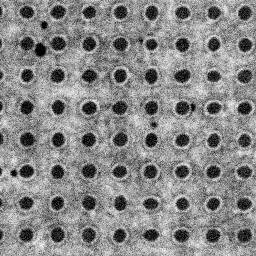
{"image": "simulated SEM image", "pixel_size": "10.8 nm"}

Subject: a regular array of raised bodies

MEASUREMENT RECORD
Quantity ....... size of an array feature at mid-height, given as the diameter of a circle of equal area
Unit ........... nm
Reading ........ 181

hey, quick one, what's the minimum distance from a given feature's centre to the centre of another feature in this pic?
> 335 nanometers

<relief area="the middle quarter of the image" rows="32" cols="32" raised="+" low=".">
................................
.....+++.....+++....+++......++.
....++++....++++....++++....++++
....++++....++++....++++...+++++
.....+++.....++.....+++.....+++.
................................
................................
................................
................................
.....+++.....++......++.....+++.
....++++....++++....++++....++++
....+++++...++++....++++....++++
.....+++.....++......++.....+++.
................................
................................
................................
................................
.....+++.....+++....+++.....+++.
+...++++....++++....++++....++++
+...++++....++++....++++....++++
.....+++.....++.....+++.....+++.
................................
................................
................................
................................
.....+++.....++.....+++.....+++.
....++++....++++....++++....++++
....++++....++++....++++....++++
.....+++.....++.....+++.....++..
................................
................................
................................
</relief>